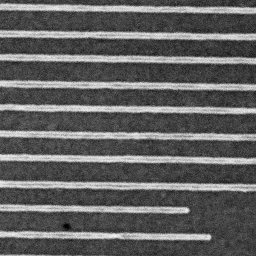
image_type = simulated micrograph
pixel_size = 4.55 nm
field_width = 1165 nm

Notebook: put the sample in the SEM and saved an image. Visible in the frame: parallel lines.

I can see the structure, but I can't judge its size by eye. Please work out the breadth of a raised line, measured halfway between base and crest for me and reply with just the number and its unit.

0.0193 microns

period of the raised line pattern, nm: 115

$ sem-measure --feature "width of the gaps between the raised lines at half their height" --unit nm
98.4